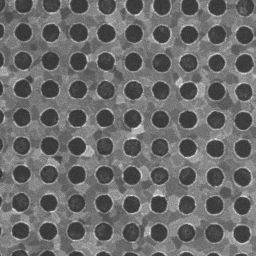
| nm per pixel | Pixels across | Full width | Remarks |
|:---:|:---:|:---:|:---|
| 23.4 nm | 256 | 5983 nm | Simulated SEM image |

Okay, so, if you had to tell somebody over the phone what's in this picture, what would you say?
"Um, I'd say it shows a regular array of holes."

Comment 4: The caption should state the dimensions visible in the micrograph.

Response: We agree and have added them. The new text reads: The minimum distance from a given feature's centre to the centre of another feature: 640 nm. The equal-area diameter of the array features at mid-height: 0.441 microns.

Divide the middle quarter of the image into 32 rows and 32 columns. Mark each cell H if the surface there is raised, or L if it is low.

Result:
HHLLLLHHLLLLLHHLLLLHHHLLLLLHHLLL
HHLLLHHHHLLLHHHHLLLHHHHLLLHHHHLL
HHHHHHHHHHHHHHHHHHHHHHHHHHHHHHHH
HHHHHHHHHHHHHHHHHHHHHHHHHHHHHHHH
HHLLLHHHHLLLHHHHLLLHHHHLLHHHHHHL
HLLLLLHHLLLLLHHLLLLLHHLLLLHHHLLL
HLLLLLHHLLLLLHHLLLLLHHLLLLLHHLLL
HLLLLLHHLLLLLHHLLLLLHHLLLLLHHLLL
HHLLLHHHHLLLHHHHLLLHHHHLLLHHHLLL
HHHHHHHHHHHHHHHHHHHHHHHHHHHHHHHH
HHHHHHHHHHHHHHHHHHHHHHHHHHHHHHHH
HHLLLHHHHLLHHHHHHLHHHHHHHHHHHHHH
HLLLLLHHLLLLHHHLLLLHHHLLLLHHHLLL
HLLLLLHHLLLLLHHLLLLLHHLLLLHHHLLL
HLLLLHHHLLLLHHHLLLLHHHLLLLHHHLLL
HHLLLHHHHLLHHHHHLLLHHHLLLLHHHLLL
HHHHHHHHHHHHHHHHHHHHHHHHHHHHHHHH
HHHHHHHHHHHHHHHHHHHHHHHHHHHHHHHH
HHLLHHHHHHLHHHHHHLHHHHHHHHHHHHHH
HLLLLHHHLLLLHHHLLLLHHHLLLLHHHLLL
HLLLLLHHLLLLLHHLLLLHHHLLLLHHHLLL
HLLLLHHHLLLLHHHLLLLHHHLLLLHHHLLL
HHLLLHHHHLLLHHHLLLLHHHLLLLHHHLLL
HHHHHHHHHHHHHHHHHHHHHHHHHHHHHHHH
HHHHHHHHHHHHHHHHHHHHHHHHHHHHHHHH
HHLLHHHHHLLHHHHHLHHHHHHHHHHHHHHH
HLLLLHHHLLLLHHHLLLLHHHLLLLHHHLLL
HLLLLLHHLLLLHHHLLLLHHHLLLLHHHLLL
HLLLLLHHLLLLHHHLLLLHHHLLLLHHHLLL
HHLLLHHHHLLLHHHLLLLHHHLLLHHHHLLL
HHHHHHHHHHHHHHHHHHHHHHHHHHHHHHHH
HHHHHHHHHHHHHHHHHHHHHHHHHHHHHHHH